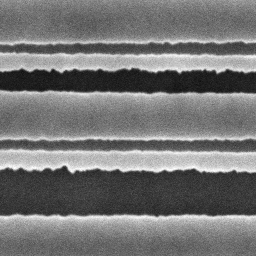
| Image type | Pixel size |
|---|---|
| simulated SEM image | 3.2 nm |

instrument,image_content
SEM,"lines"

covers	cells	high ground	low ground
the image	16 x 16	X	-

XXXXXXXXXXXXXXXX
XXXXXXXXXXXXXXXX
XXXXXXXXXXXXXXXX
XXXXXXXXXXXXXXXX
----------------
----------------
XXXXXXXXXXXXXXXX
XXXXXXXXXXXXXXXX
XXXXXXXXXXXXXXXX
XXXXXXXXXXXXXXXX
XXX-XXXXXXXXXXXX
----------------
----------------
-XX----X---XX-XX
XXXXXXXXXXXXXXXX
XXXXXXXXXXXXXXXX